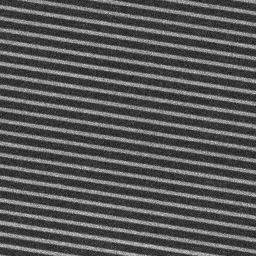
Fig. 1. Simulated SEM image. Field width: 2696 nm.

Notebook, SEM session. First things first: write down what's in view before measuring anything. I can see parallel lines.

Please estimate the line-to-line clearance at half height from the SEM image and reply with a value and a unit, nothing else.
88.4 nanometers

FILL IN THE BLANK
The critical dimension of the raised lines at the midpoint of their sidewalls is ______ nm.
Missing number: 35.1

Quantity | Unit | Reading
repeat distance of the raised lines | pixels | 11.2